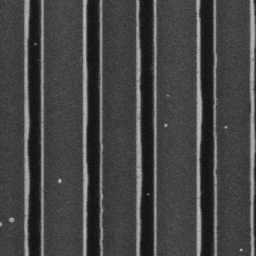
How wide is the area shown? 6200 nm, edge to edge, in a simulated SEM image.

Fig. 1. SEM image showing lines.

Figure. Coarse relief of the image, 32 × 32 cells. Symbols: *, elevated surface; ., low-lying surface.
...**......**....**......**....*
...**......**....**......**.....
...**......**....**......**.....
...**......**....**......**.....
...**......**....**......**.....
...**......**....**......**.....
...**......**....**......**.....
...**......**....**......**.....
...**......**....**......**.....
...**......**....**......**.....
...**......**....**......**.....
...**......**....**......**.....
...**......**....**......**.....
...**......**....**......**.....
...**......**....**......**.....
...**......**....**......**.....
...**......**....**......**.....
...**......**....**......**.....
...**......**....**......**.....
...**......**....**......**.....
...**......**....**......**.....
...**......**....**......**.....
...**......**....**......**.....
...**......**....**......**.....
...**......**....**......**.....
...**......**....**......**.....
...**......**....**......**.....
...**......**....**......**.....
...**......**....**......**.....
...**......**....**......**.....
...**......**....**......**.....
...**......**....**......**.....